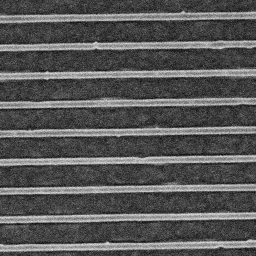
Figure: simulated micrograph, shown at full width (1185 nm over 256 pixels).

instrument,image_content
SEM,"parallel lines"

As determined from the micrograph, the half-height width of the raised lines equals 31.3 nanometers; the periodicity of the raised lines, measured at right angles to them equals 133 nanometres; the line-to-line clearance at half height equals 102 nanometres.